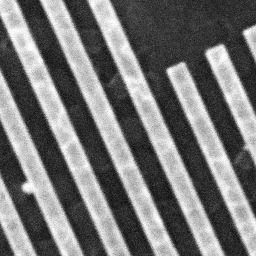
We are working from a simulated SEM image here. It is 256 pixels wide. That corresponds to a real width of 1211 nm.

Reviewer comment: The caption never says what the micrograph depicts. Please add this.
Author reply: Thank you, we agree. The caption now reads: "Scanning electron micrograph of parallel lines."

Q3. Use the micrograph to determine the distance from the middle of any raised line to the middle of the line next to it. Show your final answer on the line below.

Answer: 42.8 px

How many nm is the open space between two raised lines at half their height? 116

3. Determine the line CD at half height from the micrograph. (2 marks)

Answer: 87.3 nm